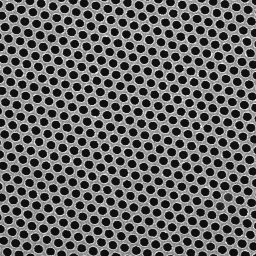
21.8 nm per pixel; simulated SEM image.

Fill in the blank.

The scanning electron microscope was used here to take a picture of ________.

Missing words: a regular array of holes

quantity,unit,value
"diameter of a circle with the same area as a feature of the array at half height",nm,189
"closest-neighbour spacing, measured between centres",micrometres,0.253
